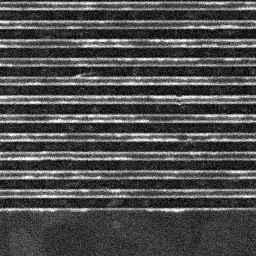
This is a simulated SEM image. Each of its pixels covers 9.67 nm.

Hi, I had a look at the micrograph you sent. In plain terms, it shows parallel lines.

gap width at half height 106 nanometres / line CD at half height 73.7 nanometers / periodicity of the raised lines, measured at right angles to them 182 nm